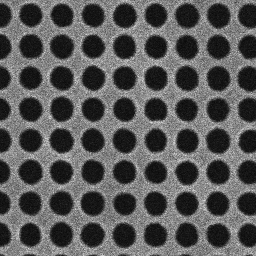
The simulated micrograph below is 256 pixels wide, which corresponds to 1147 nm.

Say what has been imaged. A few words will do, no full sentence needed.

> a regular array of holes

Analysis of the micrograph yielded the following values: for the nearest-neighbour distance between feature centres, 139 nm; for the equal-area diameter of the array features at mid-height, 110 nm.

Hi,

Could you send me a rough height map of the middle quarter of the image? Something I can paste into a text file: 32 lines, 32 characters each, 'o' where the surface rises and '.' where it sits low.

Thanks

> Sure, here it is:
oooooo..oooooooooooooo..oooooo.o
..ooo.....ooo....oooo....ooo....
..oo......oo......oo......oo....
...o.......o......oo......oo....
...o......oo......oo......oo....
..ooo.....ooo.....ooo.....oo....
.ooooo...ooooo..oooooo..ooooo...
oooooooooooooooooooooooooooooooo
.ooooo...ooooo..oooooo..oooooo.o
..ooo.....ooo....oooo....ooo....
..oo......oo......oo......oo....
..oo......oo......oo......oo....
..ooo.....oo......oo......oo....
..ooo.....ooo....oooo....oooo...
ooooooo.ooooooo.oooooooooooooo.o
oooooooooooooooooooooooooooooooo
.ooooo...oooo....ooooo..ooooo...
..ooo.....oo......ooo....ooo....
..oo......oo......oo......oo....
...o......oo......oo......oo....
..ooo.....oo......oo......oo....
..ooo....oooo....oooo....oooo...
ooooooooooooooo.oooooooooooooooo
oooooooooooooooooooooooooooooooo
.oooo....oooo....oooo...ooooo...
..ooo.....oo......ooo....ooo....
..oo......oo......oo......oo....
..oo......oo......oo......oo....
..ooo.....oo......oo......oo....
.oooo....oooo....oooo....oooo...
oooooooooooooooooooooooooooooooo
oooooooooooooooooooooooooooooooo